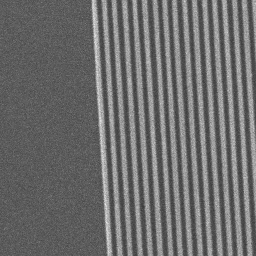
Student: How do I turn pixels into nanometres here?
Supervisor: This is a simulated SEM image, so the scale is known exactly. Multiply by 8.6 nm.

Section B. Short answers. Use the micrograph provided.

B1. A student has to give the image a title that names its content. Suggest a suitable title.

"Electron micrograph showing parallel lines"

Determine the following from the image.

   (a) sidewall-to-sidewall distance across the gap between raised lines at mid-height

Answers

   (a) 51.5 nanometres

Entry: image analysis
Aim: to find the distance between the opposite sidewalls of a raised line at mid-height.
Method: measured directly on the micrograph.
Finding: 34.3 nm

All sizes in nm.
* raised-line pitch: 85.9